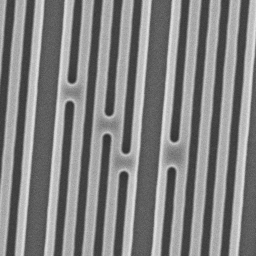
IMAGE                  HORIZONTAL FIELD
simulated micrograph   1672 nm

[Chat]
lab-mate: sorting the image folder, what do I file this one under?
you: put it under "groups of lines, slits or small figures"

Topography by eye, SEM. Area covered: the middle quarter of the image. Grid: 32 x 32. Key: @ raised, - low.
@---@@---@@--@@@---@------@@--@@
@---@@--@@@--@@@---@------@@--@@
@--@@@--@@@--@@@--@@------@@--@@
@--@@@--@@@--@@@--@@------@@--@@
@--@@@--@@---@@@--@@------@---@@
@@@@@---@@---@@@--@@------@---@@
@@@@@---@@---@@---@@------@---@@
@@@@@---@@---@@---@@-----@@---@@
@@@@@---@@---@@---@@-----@@---@@
@-@@@---@@---@@---@@-----@@---@@
---@@---@@---@@---@------@@---@@
---@@---@@---@@---@------@@--@@@
---@@---@@--@@@---@------@@--@@@
---@@---@@@@@@@--@@------@@--@@@
---@@---@@@@@@@--@@------@---@@@
---@@--@@@@@@@@--@@------@---@@@
--@@@--@@@@@@@@--@@------@---@@@
--@@@--@@@-@@@@--@@------@---@@@
--@@@--@@@--@@---@@-----@@---@@-
--@@@--@@---@@---@@-----@@@-@@@-
--@@---@@---@@---@@-----@@@@@@@-
--@@---@@---@@---@@-----@@@@@@@-
--@@---@@---@@@-@@------@@@@@@@-
--@@---@@---@@@@@@------@@@@@@@-
--@@---@@---@@@@@@------@@@@@@@-
--@@--@@@--@@@@@@@------@@@@@@@-
-@@@--@@@--@@@@@@@------@@--@@@-
-@@@--@@@--@@@--@@------@@--@@@-
-@@@--@@@--@@---@@------@@--@@--
-@@@--@@@--@@---@@------@---@@--
-@@---@@---@@---@@------@---@@--
-@@---@@---@@---@@-----@@---@@--